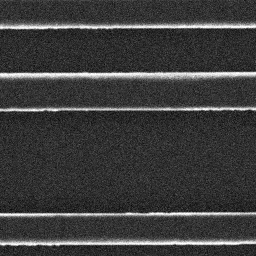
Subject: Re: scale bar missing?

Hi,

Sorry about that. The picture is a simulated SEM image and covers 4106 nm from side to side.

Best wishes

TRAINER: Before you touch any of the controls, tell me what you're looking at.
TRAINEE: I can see lines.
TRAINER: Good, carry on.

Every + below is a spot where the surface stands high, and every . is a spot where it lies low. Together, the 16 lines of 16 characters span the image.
++++++++++++++++
++++++++++++++++
................
................
................
++++++++++++++++
++++++++++++++++
................
................
................
................
................
................
++++++++++++++++
++++++++++++++++
................